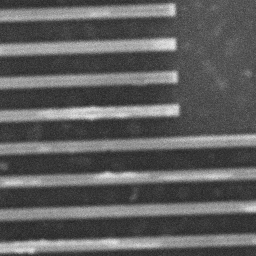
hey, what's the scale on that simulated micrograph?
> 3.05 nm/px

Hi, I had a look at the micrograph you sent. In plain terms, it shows parallel lines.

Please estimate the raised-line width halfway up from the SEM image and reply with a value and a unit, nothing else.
0.0248 um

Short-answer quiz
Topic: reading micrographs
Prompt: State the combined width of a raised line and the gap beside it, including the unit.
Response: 101 nm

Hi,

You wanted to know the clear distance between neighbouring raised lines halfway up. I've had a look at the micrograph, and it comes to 24.4 px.